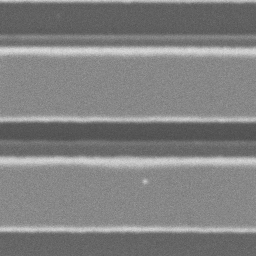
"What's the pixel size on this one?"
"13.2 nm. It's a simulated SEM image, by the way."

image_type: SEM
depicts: lines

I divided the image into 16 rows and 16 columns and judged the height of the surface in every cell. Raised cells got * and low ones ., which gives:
................
................
................
****************
****************
****************
****************
****************
................
................
****************
****************
****************
****************
................
................